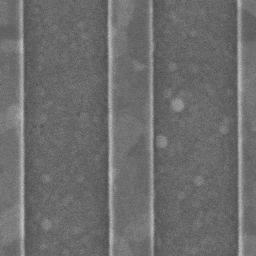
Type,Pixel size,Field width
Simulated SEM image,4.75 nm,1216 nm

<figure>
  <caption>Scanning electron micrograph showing one or a few lines or trenches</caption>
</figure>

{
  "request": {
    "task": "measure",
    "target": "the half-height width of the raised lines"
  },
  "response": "0.201 µm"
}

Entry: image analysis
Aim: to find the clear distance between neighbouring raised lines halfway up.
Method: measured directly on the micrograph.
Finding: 0.416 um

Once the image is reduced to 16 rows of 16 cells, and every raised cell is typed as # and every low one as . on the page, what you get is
#......##......#
#......##......#
#......##......#
#......##......#
#......###.....#
#......###.....#
#......###.....#
#......###.....#
#......###.....#
#......###.....#
#......###.....#
#......###.....#
#......###.....#
#......###.....#
#......###.....#
#......###.....#